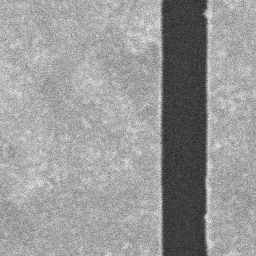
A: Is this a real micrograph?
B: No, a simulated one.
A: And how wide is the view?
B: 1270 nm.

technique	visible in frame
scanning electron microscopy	one or a few lines or trenches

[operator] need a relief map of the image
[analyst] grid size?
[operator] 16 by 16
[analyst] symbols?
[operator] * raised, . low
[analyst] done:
**********...***
**********...***
**********...***
**********...***
**********...***
**********...***
**********...***
**********...***
**********...***
**********...***
**********...***
**********...***
**********...***
**********...***
**********...***
**********...***